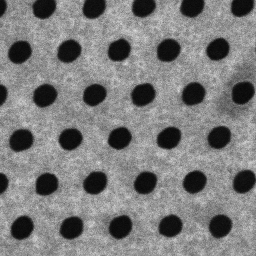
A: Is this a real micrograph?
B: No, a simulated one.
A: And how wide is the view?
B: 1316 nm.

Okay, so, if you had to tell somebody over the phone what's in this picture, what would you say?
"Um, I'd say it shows a regular array of holes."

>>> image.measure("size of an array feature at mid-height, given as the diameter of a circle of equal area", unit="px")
22.1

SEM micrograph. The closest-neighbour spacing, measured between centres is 49.4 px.